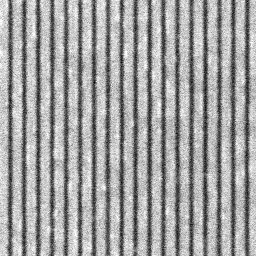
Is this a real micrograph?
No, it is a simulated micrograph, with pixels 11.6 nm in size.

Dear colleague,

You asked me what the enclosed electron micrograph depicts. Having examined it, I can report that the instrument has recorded parallel lines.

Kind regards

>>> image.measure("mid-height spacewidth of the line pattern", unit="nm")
50.9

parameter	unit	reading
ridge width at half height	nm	112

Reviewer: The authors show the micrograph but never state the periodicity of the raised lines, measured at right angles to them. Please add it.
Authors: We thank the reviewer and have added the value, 13.9 pixels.